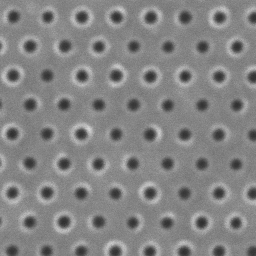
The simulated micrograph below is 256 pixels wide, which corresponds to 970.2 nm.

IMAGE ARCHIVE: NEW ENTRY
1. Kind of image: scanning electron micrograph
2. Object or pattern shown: a regular array of holes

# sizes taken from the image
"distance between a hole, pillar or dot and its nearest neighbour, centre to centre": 0.127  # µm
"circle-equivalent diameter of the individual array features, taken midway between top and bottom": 51.5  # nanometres